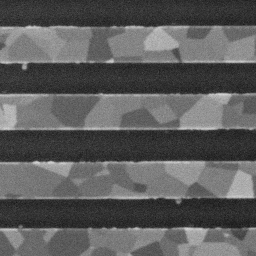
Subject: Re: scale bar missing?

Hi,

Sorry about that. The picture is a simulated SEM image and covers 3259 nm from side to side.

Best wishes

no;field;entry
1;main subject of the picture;lines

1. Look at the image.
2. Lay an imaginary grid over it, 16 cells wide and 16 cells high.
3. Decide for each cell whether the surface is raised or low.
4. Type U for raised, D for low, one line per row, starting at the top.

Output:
DDDDDDDDDDDDDDDD
DDDDDDDDDDDDDDDD
UUUUUUUUUUUUUUUU
UUUUUUUUUUUUUUUU
DDDDDDDDDDDDDDDD
DDDDDDDDDDDDDDDD
UUUUUUUUUUUUUUUU
UUUUUUUUUUUUUUUU
DDDDDDDDDDDDDDDD
DDDDDDDDDDDDDDDD
UUUUUUUUUUUUUUUU
UUUUUUUUUUUUUUUU
DDDDDDDDDDDDDDDD
DDDDDDDDDDDDDDDD
UUUUUUUUUUUUUUUU
UUUUUUUUUUUUUUUU